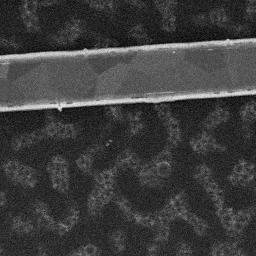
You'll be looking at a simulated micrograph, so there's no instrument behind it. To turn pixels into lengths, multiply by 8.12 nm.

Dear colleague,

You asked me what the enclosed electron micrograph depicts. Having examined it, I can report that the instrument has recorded one or a few lines or trenches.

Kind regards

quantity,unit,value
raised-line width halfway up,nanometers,420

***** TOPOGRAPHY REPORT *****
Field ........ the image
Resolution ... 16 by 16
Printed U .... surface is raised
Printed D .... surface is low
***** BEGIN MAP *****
DDDDDDDDDDDDDDDD
DDDDDDDDDDDDDDDD
DDDDDDDDDDDDDDDD
DUUUUUUUUUUUUUUU
UUUUUUUUUUUUUUUU
UUUUUUUUUUUUUUUU
UUUUUDDDDDDDDDDD
DDDDDDDDDDDDDDDD
DDDDDDDDDDDDDDDD
DDDDDDDDDDDDDDDD
DDDDDDDDDDDDDDDD
DDDDDDDDDDDDDDDD
DDDDDDDDDDDDDDDD
DDDDDDDDDDDDDDDD
DDDDDDDDDDDDDDDD
DDDDDDDDDDDDDDDD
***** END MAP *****